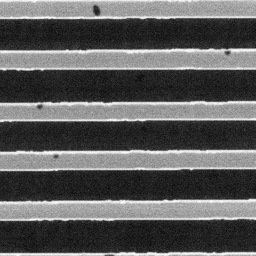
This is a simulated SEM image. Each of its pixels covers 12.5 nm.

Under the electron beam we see lines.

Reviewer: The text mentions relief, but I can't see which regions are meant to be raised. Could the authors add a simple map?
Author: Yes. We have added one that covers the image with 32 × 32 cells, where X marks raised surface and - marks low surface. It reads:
XXXXXXXXXXXXXXXXXXXXXXXXXXXXXXXX
XXXXXXXXXXXXXXXXXXXXXXXXXXXXXXXX
--------------------------------
--------------------------------
--------------------------------
--------------------------------
XXXXXXXXXXXXXXXXXXXXXXXXXXXXXXXX
XXXXXXXXXXXXXXXXXXXXXXXXXXXXXXXX
XXXXXXXXXXXXXXXXXXXXXXXXXXXXXXXX
--------------------------------
--------------------------------
--------------------------------
--------------------------------
XXXXXXXXXXXXXXXXXXXXXXXXXXXXXXXX
XXXXXXXXXXXXXXXXXXXXXXXXXXXXXXXX
--------------------------------
--------------------------------
--------------------------------
--------------------------------
XXXXXXXXXXXXXXXXXXXXXXXXXXXXXXXX
XXXXXXXXXXXXXXXXXXXXXXXXXXXXXXXX
--------------------------------
--------------------------------
--------------------------------
--------------------------------
XXXXXXXXXXXXXXXXXXXXXXXXXXXXXXXX
XXXXXXXXXXXXXXXXXXXXXXXXXXXXXXXX
--------------------------------
--------------------------------
--------------------------------
--------------------------------
--------------------------------